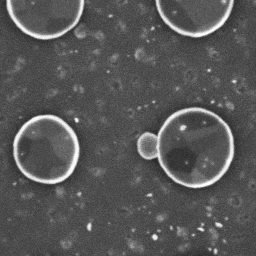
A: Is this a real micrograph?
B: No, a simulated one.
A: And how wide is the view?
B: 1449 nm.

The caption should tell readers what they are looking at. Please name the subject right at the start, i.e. raised bodies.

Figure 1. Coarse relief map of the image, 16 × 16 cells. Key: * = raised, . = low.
.****.....****..
.****......***..
................
................
................
................
................
..**.......***..
.****.....****..
.****....*****..
.****.....****..
...........**...
................
................
................
................